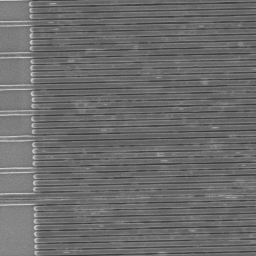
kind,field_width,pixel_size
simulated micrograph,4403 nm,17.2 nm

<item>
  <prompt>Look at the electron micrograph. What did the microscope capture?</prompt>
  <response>parallel lines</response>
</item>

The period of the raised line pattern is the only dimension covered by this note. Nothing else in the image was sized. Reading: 110 nm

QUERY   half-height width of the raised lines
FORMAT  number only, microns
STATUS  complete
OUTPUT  0.0774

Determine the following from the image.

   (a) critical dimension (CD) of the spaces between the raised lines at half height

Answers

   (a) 1.75 px